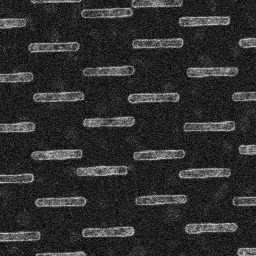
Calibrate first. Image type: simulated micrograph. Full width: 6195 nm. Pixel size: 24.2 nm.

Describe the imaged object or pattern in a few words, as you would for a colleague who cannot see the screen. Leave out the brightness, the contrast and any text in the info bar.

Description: a regular array of holes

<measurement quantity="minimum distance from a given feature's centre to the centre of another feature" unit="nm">1200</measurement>